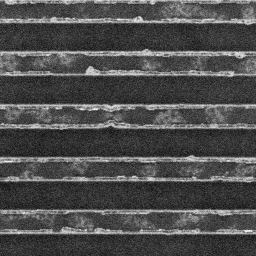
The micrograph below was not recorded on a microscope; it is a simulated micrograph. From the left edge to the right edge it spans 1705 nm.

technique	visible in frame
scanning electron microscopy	parallel lines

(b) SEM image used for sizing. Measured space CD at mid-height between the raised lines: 30.1 pixels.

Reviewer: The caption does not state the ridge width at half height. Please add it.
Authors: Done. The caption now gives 149 nanometres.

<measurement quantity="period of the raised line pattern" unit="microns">0.351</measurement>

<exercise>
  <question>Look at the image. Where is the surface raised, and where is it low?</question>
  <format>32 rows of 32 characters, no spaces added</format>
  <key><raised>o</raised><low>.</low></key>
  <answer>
oooooooooooooooooooooooooooooooo
oooooooooooooooooooooooooooooooo
oooooooooooooooooooooooooooooooo
................................
................................
................................
.................oo.............
oooooooooooooooooooooooooooooooo
oooooooooooooooooooooooooooooooo
................................
................................
................................
................................
oooooooooooooooooooooooooooooooo
oooooooooooooooooooooooooooooooo
oooooooooooooooooooooooooooooooo
................................
................................
................................
................................
oooooooooooooooooooooooooooooooo
oooooooooooooooooooooooooooooooo
ooo...................oo....oooo
................................
................................
................................
oooooooooooooooooooooooooooooooo
oooooooooooooooooooooooooooooooo
oooooooooooooooooooooooooooooooo
................................
................................
................................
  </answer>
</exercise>